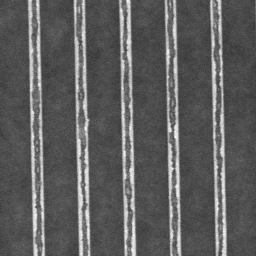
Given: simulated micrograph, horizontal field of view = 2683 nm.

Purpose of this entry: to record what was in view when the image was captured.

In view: parallel lines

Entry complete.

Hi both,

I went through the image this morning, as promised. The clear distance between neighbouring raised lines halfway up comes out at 372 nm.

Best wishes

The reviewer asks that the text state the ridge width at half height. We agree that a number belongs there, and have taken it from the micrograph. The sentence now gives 0.106 um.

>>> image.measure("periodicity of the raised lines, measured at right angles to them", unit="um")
0.477